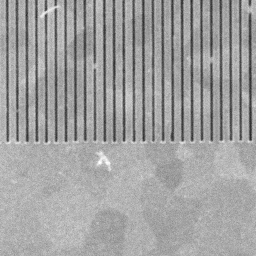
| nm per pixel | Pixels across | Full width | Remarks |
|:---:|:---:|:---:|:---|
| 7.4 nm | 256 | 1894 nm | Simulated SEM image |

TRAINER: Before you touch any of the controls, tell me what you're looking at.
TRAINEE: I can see parallel lines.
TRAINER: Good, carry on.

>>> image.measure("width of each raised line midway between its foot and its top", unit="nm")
50.9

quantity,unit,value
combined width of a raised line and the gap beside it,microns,0.0718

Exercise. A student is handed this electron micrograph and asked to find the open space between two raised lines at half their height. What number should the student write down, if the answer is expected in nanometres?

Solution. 25